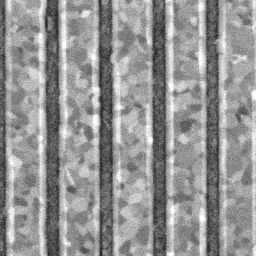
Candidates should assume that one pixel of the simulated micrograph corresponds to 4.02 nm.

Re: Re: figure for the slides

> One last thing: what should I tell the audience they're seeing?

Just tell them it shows parallel lines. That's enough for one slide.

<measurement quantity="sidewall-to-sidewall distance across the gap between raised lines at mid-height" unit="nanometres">67.1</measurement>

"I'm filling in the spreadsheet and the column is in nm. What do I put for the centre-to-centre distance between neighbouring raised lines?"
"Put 215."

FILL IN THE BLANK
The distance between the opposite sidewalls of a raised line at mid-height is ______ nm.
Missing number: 146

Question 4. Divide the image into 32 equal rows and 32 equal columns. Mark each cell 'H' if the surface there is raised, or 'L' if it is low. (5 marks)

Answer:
LHHHHLLLHHHHLLHHHHHLLHHHHLLLHHHH
LHHHHLLLHHHHLLHHHHHLLHHHHLLLHHHH
LHHHHLLLHHHHLLHHHHHLLHHHHLLLHHHH
LHHHHLLLHHHHLLHHHHHLLHHHHLLLHHHH
LHHHHLLLHHHHLLHHHHHLLHHHHLLLHHHH
LHHHHLLLHHHHLLHHHHHLLHHHHLLLHHHH
LHHHHLLLHHHHLLHHHHHLLHHHHLLLHHHH
LHHHHLLLHHHHLLHHHHHLLHHHHLLLHHHH
LHHHHLLLHHHHLLHHHHHLLHHHHLLLHHHH
LHHHHLLLHHHHLLHHHHHLLHHHHLLLHHHH
LHHHHLLLHHHHLLHHHHHLLHHHHLLLHHHH
LHHHHLLLHHHHLLHHHHHLLHHHHLLLHHHH
LHHHHLLLHHHHLLHHHHHLLHHHHLLLHHHH
LHHHHLLLHHHHLLHHHHHLLHHHHLLLHHHH
LHHHHLLLHHHHLLHHHHHLLHHHHLLLHHHH
LHHHHLLLHHHHLLHHHHHLLHHHHLLLHHHH
LHHHHLLLHHHHLLHHHHHLLHHHHLLLHHHH
LHHHHLLLHHHHLLHHHHHLLHHHHHLLHHHH
LHHHHLLLHHHHLLHHHHHLLHHHHHLLHHHH
LHHHHLLLHHHHLLHHHHHLLHHHHHLLHHHH
LHHHHLLLHHHHLLHHHHHLLHHHHHLLHHHH
LHHHHLLLHHHHLLHHHHHLLHHHHHLLHHHH
LHHHHLLLHHHHLLHHHHHLLHHHHHLLHHHH
LHHHHLLLHHHHLLHHHHHLLHHHHHLLHHHH
LHHHHHLLHHHHLLHHHHHLLHHHHHLLHHHH
LHHHHLLLHHHHLLHHHHHLLHHHHHLLHHHH
LHHHHLLLHHHHLLLHHHHLLHHHHHLLHHHH
LHHHHLLLHHHHLLLHHHHLLHHHHHLLHHHH
LHHHHLLLHHHHLLLHHHHLLHHHHHLLHHHH
LHHHHLLLHHHHLLLHHHHLLHHHHHLLHHHH
LHHHHLLLHHHHLLLHHHHLLHHHHHLLHHHH
LHHHHLLLHHHHLLLHHHHLLHHHHHLLHHHH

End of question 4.